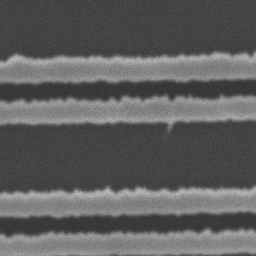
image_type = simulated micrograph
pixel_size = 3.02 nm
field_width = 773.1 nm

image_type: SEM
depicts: lines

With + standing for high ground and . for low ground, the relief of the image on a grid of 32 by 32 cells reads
................................
................................
................................
................................
................................
................................
................................
.+++++++++++++++++++++++++++++++
++++++++++++++++++++++++++++++++
++++++++++++++++++++++++++++++++
................................
................................
..+....++++...++++++++++++++++++
++++++++++++++++++++++++++++++++
++++++++++++++++++++++++++++++++
.....................+..........
................................
................................
................................
................................
................................
................................
................................
.................+..............
++++++++++++++++++++++++++++++++
++++++++++++++++++++++++++++++++
+++++++++++++++++++++++++.++++.+
................................
................................
+++.++++++++++++++++++++++++++++
++++++++++++++++++++++++++++++++
++++++++++++++++++++++++++++++++